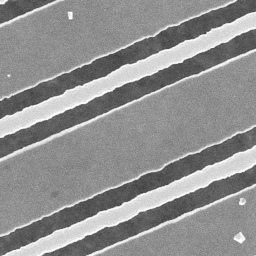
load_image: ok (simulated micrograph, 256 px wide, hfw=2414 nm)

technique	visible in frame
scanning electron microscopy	lines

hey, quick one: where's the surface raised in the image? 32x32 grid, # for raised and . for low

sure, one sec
......#######################...
....######################......
.######################.......##
#####################......#####
###################......####...
#################......####.....
##############......#####......#
############......#####......###
##########.....######.....######
#######......#####......########
#####......#####......##########
###.....#####......#############
......#####......###############
...######......#################
.######.....####################
####......######################
##......#######################.
.....#######################....
...#######################......
.######################......###
#####################......#####
###################......#####..
#################.....#####.....
##############......#####......#
############.....######......###
#########......#####......######
#######......#####......########
#####......#####......##########
##......#####......#############
......#####......###############
....####......##################
.#####......####################